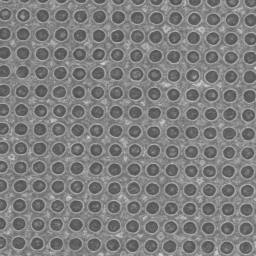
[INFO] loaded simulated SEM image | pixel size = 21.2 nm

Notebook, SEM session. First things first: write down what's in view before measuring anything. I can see a regular array of holes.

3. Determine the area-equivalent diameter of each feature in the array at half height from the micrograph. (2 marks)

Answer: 278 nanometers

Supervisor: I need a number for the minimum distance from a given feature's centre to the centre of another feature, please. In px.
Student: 18.4